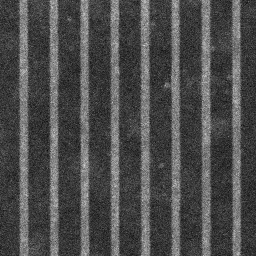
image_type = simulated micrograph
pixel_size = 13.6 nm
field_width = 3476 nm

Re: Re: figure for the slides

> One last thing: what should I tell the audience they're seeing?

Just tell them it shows parallel lines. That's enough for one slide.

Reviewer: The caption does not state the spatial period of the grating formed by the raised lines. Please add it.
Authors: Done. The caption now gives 413 nm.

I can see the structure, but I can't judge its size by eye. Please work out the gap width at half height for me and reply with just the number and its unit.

76.4 nanometers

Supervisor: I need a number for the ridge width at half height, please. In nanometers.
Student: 333